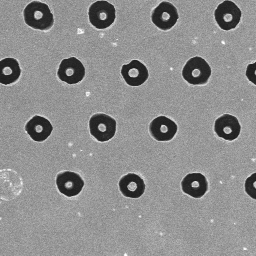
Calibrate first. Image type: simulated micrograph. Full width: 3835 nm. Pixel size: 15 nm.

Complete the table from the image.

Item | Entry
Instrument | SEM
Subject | a regular array of ring-shaped grooves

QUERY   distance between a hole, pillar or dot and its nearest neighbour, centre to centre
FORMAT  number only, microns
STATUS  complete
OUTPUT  0.935